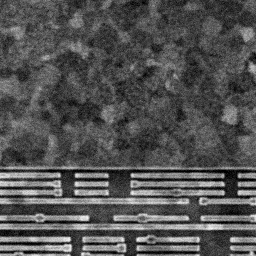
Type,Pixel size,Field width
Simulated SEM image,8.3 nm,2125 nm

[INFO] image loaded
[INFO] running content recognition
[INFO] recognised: wiring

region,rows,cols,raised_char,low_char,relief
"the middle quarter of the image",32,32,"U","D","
UUUUUUUUUUUUUUUUUUUUUUUUUUUUUUUU
UUUUUUUUUUUUUUUUUUUUUUUUUUUUUUUU
UUUUUUUUUUUUUUUUUUUUUUUUUUUUUUUU
UUUUUUUUUUUUUUUUUUUUUUUUUUUUUUUU
UUUUUUUUUUUUUUUUUUUUUUUUUUUUUUUU
UUUUUUUUUUUUUUUUUUUUUUUUUUUUUUUU
UUUUUUUUUUUUUUUUUUUUUUUUUUUUUUUU
UUUUUUUUUUUUUUUUUUUUUUUUUUUUUUUU
UUUUUUUUUUUUUUUUUUUUUUUUUUUUUUUU
UUUUUUUUUUUUUUUUUUUUUUUUUUUUUUUU
UUUUUUUUUUUUUUUUUUUUUUUUUUUUUUUU
UUUUUUUUUUUUUUUUUUUUUUUUUUUUUUUU
UUUUUUUUUUUUUUUUUUUUUUUUUUUUUUUU
UUUUUUUUUUUUUUUUUUUUUUUUUUUUUUUU
UUUUUUUUUUUUUUUUUUUUUUUUUUUUUUUU
UUUUUUUUUUUUUUUUUUUUUUUUUUUUUUUU
UUUUUUUUUUUUUUUUUUUUUUUUUUUUUUUU
UUUUUUUUUUUUUUUUUUUUUUUUUUUUUUUU
UUUUUUUUUUUUUUUUUUUUUUUUUUUUUUUU
UUUUUUUUUUUUUUUUUUUUUUUUUUUUUUUU
UUUUUUUUUUUUUUUUUUUUUUUUUUUUUUUU
UUUUUUUUUUUUUUUUUUUUUUUUUUUUUUUU
UUUUUUUUUUUUUUUUUUUUUUUUUUUUUUUU
UUUUUUUUUUUUUUUUUUUUUUUUUUUUUUUU
UUUUUUUUUUUUUUUUUUUUUUUUUUUUUUUU
UUUUUUUUUUUUUUUUUUUUUUUUUUUUUUUU
DDDDDDDDDDDDDDDDDDDDDDDDDDDDDDDD
DDDDDDDDDDDDDDDDDDDDDDDDDDDUUUUU
DDDDDDDDDDDDDDDDDDDDDDDDDDDDDDDD
DDDDDDDDDDDDDDDDDUUDDDDDDDDDDDDD
DDDDDDDDDDDDDDDDDUUDDDDDDUUUUUUU
DDDDDDDDDDDDDDDDDDDDDDDDDDDUUDDD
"